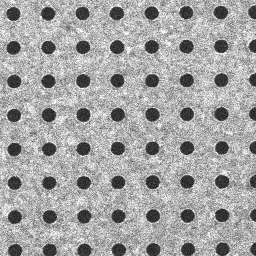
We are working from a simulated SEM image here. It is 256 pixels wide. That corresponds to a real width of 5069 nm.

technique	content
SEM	a regular array of holes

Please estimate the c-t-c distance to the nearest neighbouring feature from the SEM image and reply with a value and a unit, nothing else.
33.7 px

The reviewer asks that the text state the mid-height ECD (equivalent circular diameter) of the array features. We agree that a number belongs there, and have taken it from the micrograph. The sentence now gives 14.3 pixels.